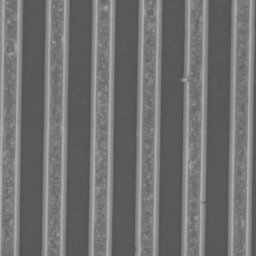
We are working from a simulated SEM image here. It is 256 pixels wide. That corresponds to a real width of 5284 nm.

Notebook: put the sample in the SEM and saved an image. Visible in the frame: parallel lines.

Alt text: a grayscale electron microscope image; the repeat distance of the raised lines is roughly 46.4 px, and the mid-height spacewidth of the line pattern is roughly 0.583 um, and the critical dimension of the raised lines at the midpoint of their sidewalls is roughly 0.382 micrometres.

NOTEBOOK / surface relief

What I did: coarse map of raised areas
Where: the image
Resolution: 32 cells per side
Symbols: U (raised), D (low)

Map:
UUDDDDUUDDDDUUDDDDUUDDDDUUDDDUUU
UUDDDDUUDDDDUUDDDDUUDDDUUUDDDUUD
UUDDDDUUDDDDUUDDDDUUDDDUUUDDDUUD
UUDDDDUUDDDDUUDDDDUUDDDUUUDDDUUD
UUDDDDUUDDDDUUDDDDUUDDDUUUDDDUUD
UUDDDDUUDDDDUUDDDDUUDDDUUUDDDUUD
UUDDDDUUDDDDUUDDDDUUDDDUUUDDDUUD
UUDDDDUUDDDDUUDDDDUUDDDUUUDDDUUD
UUDDDDUUDDDDUUDDDDUUDDDUUUDDDUUD
UUDDDDUUDDDDUUDDDDUUDDDUUUDDDUUD
UUDDDDUUDDDDUUDDDDUUDDDUUUDDDUUD
UUDDDDUUDDDDUUDDDDUUDDDUUUDDDUUD
UUDDDDUUDDDDUUDDDUUUDDDUUUDDDUUD
UUDDDDUUDDDDUUDDDUUUDDDUUUDDDUUD
UUDDDDUUDDDDUUDDDUUUDDDUUDDDDUUD
UUDDDDUUDDDDUUDDDUUUDDDUUDDDDUUD
UUDDDDUUDDDDUUDDDUUUDDDUUDDDDUUD
UUDDDDUUDDDDUUDDDUUUDDDUUDDDDUUD
UUDDDDUUDDDDUUDDDUUUDDDUUDDDDUUD
UUDDDDUUDDDDUUDDDUUUDDDUUDDDDUUD
UUDDDDUUDDDDUUDDDUUUDDDUUDDDDUUD
UUDDDDUUDDDDUUDDDUUUDDDUUDDDDUUD
UUDDDDUUDDDDUUDDDUUUDDDUUDDDDUUD
UUDDDDUUDDDDUUDDDUUUDDDUUDDDDUUD
UUDDDDUUDDDDUUDDDUUUDDDUUDDDDUUD
UUDDDDUUDDDDUUDDDUUDDDDUUDDDDUUD
UUDDDDUUDDDDUUDDDUUDDDDUUDDDDUUD
UUDDDDUUDDDUUUDDDUUDDDDUUDDDDUUD
UUDDDDUUDDDUUUDDDUUDDDDUUDDDDUUD
UUDDDDUUDDDUUUDDDUUDDDDUUDDDDUUD
UUDDDDUUDDDUUUDDDUUDDDDUUDDDDUUD
UUDDDDUUDDDUUUDDDUUDDDDUUDDDDUUD